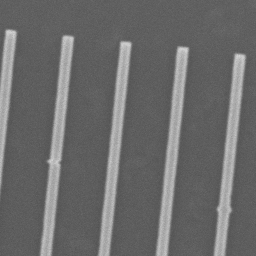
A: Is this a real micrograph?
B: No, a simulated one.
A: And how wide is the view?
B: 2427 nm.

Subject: parallel lines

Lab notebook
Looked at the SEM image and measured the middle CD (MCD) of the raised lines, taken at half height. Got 83.6 nanometers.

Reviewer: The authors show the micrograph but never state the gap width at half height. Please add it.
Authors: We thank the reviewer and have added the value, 463 nm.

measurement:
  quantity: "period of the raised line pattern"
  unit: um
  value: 0.546